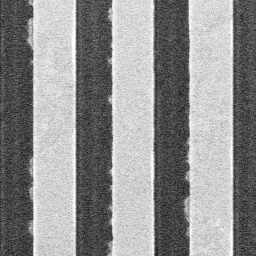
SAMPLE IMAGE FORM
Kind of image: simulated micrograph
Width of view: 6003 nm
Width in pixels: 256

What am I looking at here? lines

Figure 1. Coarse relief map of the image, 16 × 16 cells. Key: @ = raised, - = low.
--@@@--@@@--@@--
--@@@--@@@--@@--
--@@@--@@@--@@--
--@@@--@@@--@@--
--@@@--@@@--@@--
--@@@--@@@--@@--
--@@@--@@@--@@--
--@@@--@@@--@@--
--@@@--@@@--@@--
--@@@--@@@--@@--
--@@@--@@@--@@--
--@@@--@@@--@@--
--@@@--@@@--@@--
--@@@--@@@--@@--
--@@@--@@@--@@--
--@@@--@@@--@@--